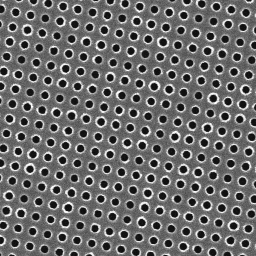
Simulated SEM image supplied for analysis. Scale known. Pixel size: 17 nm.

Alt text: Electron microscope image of a regular array of holes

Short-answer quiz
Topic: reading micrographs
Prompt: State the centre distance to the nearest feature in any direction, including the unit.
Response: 0.254 um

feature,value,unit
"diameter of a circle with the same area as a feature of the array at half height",129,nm